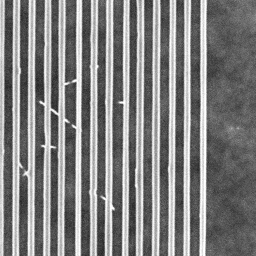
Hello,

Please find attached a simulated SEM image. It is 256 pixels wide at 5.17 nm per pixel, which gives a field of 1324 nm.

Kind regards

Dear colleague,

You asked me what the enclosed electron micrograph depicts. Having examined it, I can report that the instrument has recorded parallel lines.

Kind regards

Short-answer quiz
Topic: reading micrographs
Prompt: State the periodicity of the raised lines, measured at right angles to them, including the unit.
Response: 80.6 nm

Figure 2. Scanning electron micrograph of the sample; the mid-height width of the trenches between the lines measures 54.3 nm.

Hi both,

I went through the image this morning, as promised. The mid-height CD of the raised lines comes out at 27.2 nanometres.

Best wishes